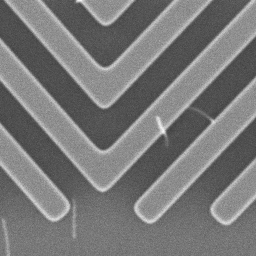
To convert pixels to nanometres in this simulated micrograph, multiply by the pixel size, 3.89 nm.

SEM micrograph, groups of lines, slits or small figures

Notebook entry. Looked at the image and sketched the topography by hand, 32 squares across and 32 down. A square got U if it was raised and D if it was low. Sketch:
DUUUUUDDDDUUUUUUDDDDDUUUUUDDDDDU
DDUUUUDDDDDUUUUDDDDDUUUUUDDDDDUU
DDDUUUUDDDDDUUDDDDDUUUUUDDDDDUUU
DDDDUUUUDDDDDDDDDDUUUUUDDDDDUUUU
DDDDUUUUUDDDDDDDDDUUUUDDDDDUUUUU
UDDDDUUUUUDDDDDDUUUUUDDDDDUUUUUD
UDDDDDUUUUUDDDDDUUUUDDDDDUUUUUDD
UUDDDDDUUUUUDDDUUUUDDDDDUUUUUDDD
UUUDDDDDUUUUUUUUUUDDDDDUUUUUDDDD
UUUUDDDDDUUUUUUUUDDDDDUUUUUDDDDD
UUUUUDDDDDUUUUUUDDDDDUUUUUDDDDDU
DUUUUUDDDDDUUUUUDDDDUUUUUDDDDDUU
DDUUUUUDDDDDUUUDDDDDUUUUDDDDDUUU
DDDUUUUUDDDDDDDDDDDUUUUDDDDDUUUU
DDDDUUUUUDDDDDDDDDUUUUDDDDDUUUUU
DDDDDUUUUDDDDDDDDUUUUDDDDDUUUUUD
UDDDDDUUUUDDDDDDUUUUUDDDDUUUUUDD
UUDDDDDUUUUDDDDUUUUDDDDDDUUUUDDD
UUUDDDDUUUUUDDUUUUUDDDDUUUUUDDDD
UUUUDDDDUUUUUUUUUUDDDDDUUUUDDDDD
UUUUDDDDDUUUUUUUUDDDDDUUUUDDDDDU
DUUUUDDDDDUUUUUUDDDDDUUUUDDDDDUU
DDUUUUDDDDDUUUUDDDDDUUUUDDDDDUUU
DDDUUUUDDDDDUUDDDDDUUUUDDDDDUUUU
DDDUUUUUDDDDDDDDDDUUUUUDDDDUUUUU
DDDDUUUUUDDDDDDDDUUUUDDDDDDUUUUD
DDDDDUUUDDDDDDDDDUUUUDDDDDUUUUDD
DDDDDDUDDDDDDDDDDDUUDDDDDDDUUDDD
DDDDDDDDDDDDDDDDDDDDDDDDDDDDDDDD
DDDDDDDDDDDDDDDDDDDDDDDDDDDDDDDD
DDDDDDDDDDDDDDDDDDDDDDDDDDDDDDDD
DDDDDDDDDDDDDDDDDDDDDDDDDDDDDDDD